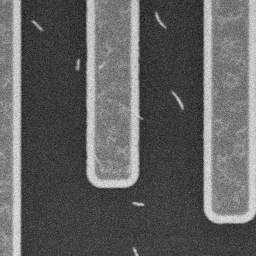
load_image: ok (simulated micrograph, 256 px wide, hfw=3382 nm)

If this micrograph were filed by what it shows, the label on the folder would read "one or a few lines or trenches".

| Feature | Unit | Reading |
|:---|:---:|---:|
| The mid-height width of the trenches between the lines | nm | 972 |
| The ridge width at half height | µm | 0.586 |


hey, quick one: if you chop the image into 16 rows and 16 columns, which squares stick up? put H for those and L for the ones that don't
HLLLLLHHLLLLLHHH
HLLLLLHHLLLLLHHH
HLLLLLHHLLLLLHHH
HLLLLLHHLLLLLHHH
HLLLLLHHLLLLLHHH
HLLLLLHHLLLLLHHH
HLLLLLHHLLLLLHHH
HLLLLLHHLLLLLHHH
HLLLLLHHLLLLLHHH
HLLLLLHHLLLLLHHH
HLLLLLHHLLLLLHHH
HLLLLLLLLLLLLHHH
HLLLLLLLLLLLLHHH
HLLLLLLLLLLLLHHL
HLLLLLLLLLLLLLLL
HLLLLLLLLLLLLLLL